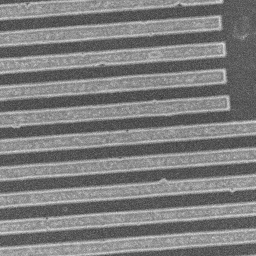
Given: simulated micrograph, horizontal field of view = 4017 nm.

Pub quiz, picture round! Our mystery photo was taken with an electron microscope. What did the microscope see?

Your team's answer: parallel lines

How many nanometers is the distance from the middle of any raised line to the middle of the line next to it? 421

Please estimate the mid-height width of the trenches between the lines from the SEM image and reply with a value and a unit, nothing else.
0.248 um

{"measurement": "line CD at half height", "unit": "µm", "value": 0.172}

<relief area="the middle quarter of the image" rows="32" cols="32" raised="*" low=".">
**..............................
................................
...............................*
..............******************
....****************************
**************************......
************....................
................................
................................
......................**********
...........*********************
.*******************************
************************.**.....
***********.....................
................................
................................
.......................*********
..........**********************
*******************************.
*******************.............
*******.........................
................................
................................
....................************
......**************************
***************************.....
**************..................
..**............................
................................
........................**...***
................****************
...*****************************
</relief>